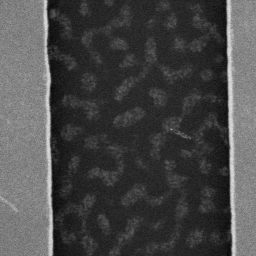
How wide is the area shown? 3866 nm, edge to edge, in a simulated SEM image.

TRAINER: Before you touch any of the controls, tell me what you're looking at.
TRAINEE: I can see one or a few lines or trenches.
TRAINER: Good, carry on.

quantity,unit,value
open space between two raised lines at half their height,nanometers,2750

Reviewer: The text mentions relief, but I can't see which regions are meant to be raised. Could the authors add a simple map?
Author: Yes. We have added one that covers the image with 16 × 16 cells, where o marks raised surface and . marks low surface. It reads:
ooo...........oo
ooo...........oo
ooo...........oo
ooo...........oo
ooo...........oo
ooo...........oo
ooo...........oo
ooo...........oo
ooo...........oo
ooo...........oo
ooo...........oo
ooo............o
ooo............o
ooo............o
ooo............o
ooo............o